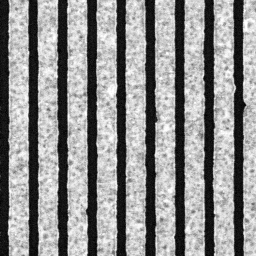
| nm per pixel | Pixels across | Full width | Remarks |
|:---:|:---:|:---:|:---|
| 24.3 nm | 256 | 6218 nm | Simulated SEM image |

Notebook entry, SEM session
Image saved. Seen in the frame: parallel lines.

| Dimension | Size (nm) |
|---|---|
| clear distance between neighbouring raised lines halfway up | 255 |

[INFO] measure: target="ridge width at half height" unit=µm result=0.446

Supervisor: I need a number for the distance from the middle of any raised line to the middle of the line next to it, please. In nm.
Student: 710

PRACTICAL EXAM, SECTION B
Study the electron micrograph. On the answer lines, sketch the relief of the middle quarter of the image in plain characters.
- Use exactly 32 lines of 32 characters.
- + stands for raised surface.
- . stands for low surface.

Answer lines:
.+++++..+++++...++++...+++++..++
.+++++..+++++..+++++...+++++..++
.+++++..+++++..+++++...+++++..++
.+++++..+++++..+++++...+++++..++
.+++++..+++++..+++++...+++++..++
.+++++..+++++..+++++...+++++..++
.+++++..+++++...++++...+++++..++
.+++++..+++++...++++...+++++..++
.+++++..+++++...++++...+++++..++
.+++++..+++++...++++...+++++..++
.+++++..+++++..+++++...+++++..++
.+++++..+++++...++++...+++++..++
.++++...+++++...++++...+++++..++
.+++++..+++++...++++...+++++..++
.+++++..+++++..+++++...+++++..++
.+++++..+++++...++++...+++++..++
.+++++..+++++...++++...+++++..++
.+++++..+++++...++++...+++++..++
.+++++..+++++...++++...+++++..++
.+++++..+++++...++++...+++++..++
.+++++..+++++...++++...+++++..++
.+++++..+++++...++++...+++++..++
.+++++..+++++...++++...+++++..++
.+++++...++++...++++...+++++..++
.+++++...++++...++++...+++++..++
.+.+++...++++...++++...+++++..++
.+++++...++++...++++...+++++..++
.+++++...++++...++++...+++++..++
.+++++...++++...++++...+++++..++
.+++++..+++++...++++...+++++..++
.+++++...++++...++++...+++++..++
.+++++...++++...++++...+++++..++